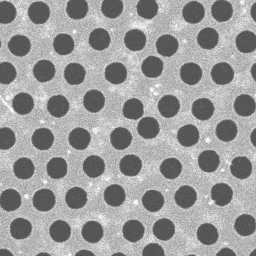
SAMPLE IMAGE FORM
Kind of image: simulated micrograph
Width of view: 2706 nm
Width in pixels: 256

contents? a regular array of holes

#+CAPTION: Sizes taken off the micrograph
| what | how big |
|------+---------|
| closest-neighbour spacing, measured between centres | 337 nanometres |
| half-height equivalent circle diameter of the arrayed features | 0.241 µm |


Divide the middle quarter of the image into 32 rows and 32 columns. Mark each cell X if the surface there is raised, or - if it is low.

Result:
X----XXXXXX----XXXX------XXXX---
-----XXXXX------XXX------XXXX---
------XXXX------XXXX----XXXXX---
-----XXXXX------XXXXX--XXXXXX---
X----XXXXXX----XXXXXXXXXXXXXXX--
XXXXXXXXXXXXXXXXXXXXXXXXXXXXXXXX
XXXXXXX--XXXXXXXXXXXXXXXXXXXXXXX
XXXXX-----XXXXXXXXXXXXXXXXXXXXXX
XXXXX-----XXXXXXX-XXXXXX----XXXX
-XXXX-----XXXXX----XXXXX-----XXX
--XXX-----XXXXX-----XXX------XXX
-XXXXX---XXXXX------XXXX-----XXX
-XXXXXXXXXXXXXX-----XXXX----XXXX
XXXXXXXXXXXXXXX--------XXXXXXXXX
XXXXXXXXXXXXXXXXXX------XXXXXXXX
XXXXXXXXXXXXXXXXXX------XXXXXX--
XX----XXXXXX----XX------XXXXX---
X------XXXXX-----XX-----XXXX----
X------XXXX------XXX---XXXXX----
X------XXXXX-----XXXXXXXXXXXX---
XX----XXXXXX----XXXXXXXXXXXXX---
XXXXXXXXXXXXXX-XXXXXXXXXXXXXXXXX
XXXXXXXXXXXXXXXX-XXXXXXXXXXXXXXX
XXXXXX---XXXXX-----XXXXXXX--XXXX
-XXXX-----XXXX------XXXX-----XXX
-XXXX-----XXXX------XXXX------XX
-XXXX-----XXXX-----XXXXX------XX
-XXXX-----XXXXX----XXXXX-----XXX
XXXXXXXXXXXXXXXXXXXXXXXXX---XXXX
XXXXXXXXXXXXXXXXXXXXXXXXXXXXXXXX
XXXXXXXXXXX---XXXXXXXXXXXXXXX---
X----XXXXX-----XXXXXXX-XXXXX----